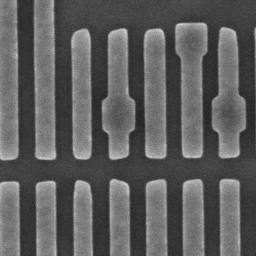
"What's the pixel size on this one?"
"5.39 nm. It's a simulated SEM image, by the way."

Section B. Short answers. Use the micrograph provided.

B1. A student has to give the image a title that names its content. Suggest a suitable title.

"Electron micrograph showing wiring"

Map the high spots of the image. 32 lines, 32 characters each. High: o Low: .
oo..ooo.........................
oo..ooo.........................
oo..ooo.........................
oo..ooo...............oooo......
oo..ooo..oo...oo..oo..oooo.ooo..
oo..ooo..oo...oo..ooo.oooo.ooo..
oo..ooo..oo...oo..ooo.oooo.ooo..
oo..ooo..oo...oo..ooo..oo..ooo..
oo..ooo..oo...oo..ooo..oo..ooo..
oo..ooo..oo...oo..ooo..oo..ooo..
oo..ooo..oo...oo..ooo..oo..ooo..
oo..ooo..oo...oo..ooo..oo..ooo..
oo..ooo..oo..oooo.ooo..oo..ooo..
oo..ooo..oo..oooo.ooo..oo..oooo.
oo..ooo..oo..oooo.ooo..oo..oooo.
oo..ooo..oo..oooo.ooo..oo..oooo.
oo..ooo..oo..ooo..ooo..oo..ooo..
oo...oo..oo...oo..ooo..oo..ooo..
oo...oo..oo...oo..ooo..oo..ooo..
oo...oo..oo...oo...o...oo...oo..
................................
................................
..............o.........o...o...
oo...oo..oo...oo..ooo..oo...oo..
oo...oo..oo...oo..ooo..oo...oo..
oo...oo..oo...oo..ooo..oo...oo..
oo...oo..oo...oo..ooo..oo...oo..
oo...oo..oo...oo..ooo..oo...oo..
oo...oo..oo...oo..ooo..oo...oo..
oo...oo..oo...oo..ooo..oo...oo..
oo...oo..oo...oo..ooo..oo...oo..
oo...oo..oo...oo..ooo..oo...oo..